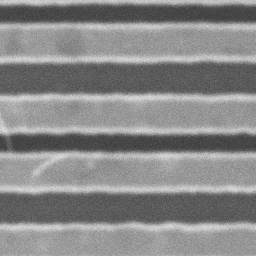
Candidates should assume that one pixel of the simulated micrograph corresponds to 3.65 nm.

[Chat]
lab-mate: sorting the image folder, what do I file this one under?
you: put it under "lines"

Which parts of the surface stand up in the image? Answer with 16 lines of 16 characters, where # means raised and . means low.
................
..##############
################
################
................
................
################
################
................
....#...........
################
################
................
................
################
################